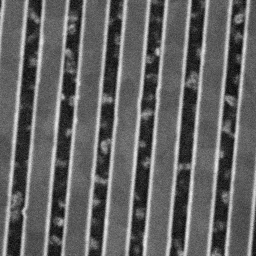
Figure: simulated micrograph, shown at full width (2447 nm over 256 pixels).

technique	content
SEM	parallel lines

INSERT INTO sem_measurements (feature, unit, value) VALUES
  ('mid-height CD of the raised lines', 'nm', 226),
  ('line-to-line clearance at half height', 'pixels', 16.9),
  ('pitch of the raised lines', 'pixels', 40.7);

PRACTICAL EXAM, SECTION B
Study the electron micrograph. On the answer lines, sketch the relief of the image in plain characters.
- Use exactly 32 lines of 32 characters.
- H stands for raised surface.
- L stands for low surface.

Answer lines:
HHHLLHHHLLLHHHLLHHHLLHHHLLHHHLLH
HHHLLHHHLLHHHHLLHHHLLHHHLLHHHLLH
HHHLLHHHLLHHHLLHHHLLLHHHLLHHHLLH
HHHLLHHHLLHHHLLHHHLLLHHLLLHHHLLH
HHHLLHHHLLHHHLLHHHLLHHHLLLHHLLLH
HHHLLHHHLLHHHLLHHHLLHHHLLHHHLLLH
HHHLLHHHLLHHHLLHHHLLHHHLLHHHLLHH
HHHLLHHHLLHHHLLHHHLLHHHLLHHHLLHH
HHHLLHHHLLHHHLLHHHLLHHHLLHHHLLHH
HHHLLHHHLLHHHLLHHHLLHHHLLHHHLLHH
HHHLLHHHLLHHHLLHHHLLHHHLLHHHLLHH
HHLLHHHHLLHHHLLHHHLLHHHLLHHHLLHH
HHLLHHHLLLHHHLLHHHLLHHHLLHHHLLHH
HHLLHHHLLHHHLLLHHLLLHHHLLHHHLLHH
HHLLHHHLLHHHLLHHHLLLHHLLLHHHLLHH
HHLLHHHLLHHHLLHHHLLHHHLLLHHLLLHH
HHLLHHHLLHHHLLHHHLLHHHLLHHHLLLHH
HHLLHHHLLHHHLLHHHLLHHHLLHHHLLHHH
HHLLHHHLLHHHLLHHHLLHHHLLHHHLLHHH
HHLLHHHLLHHHLLHHHLLHHHLLHHHLLHHH
HHLLHHHLLHHHLLHHHLLHHHLLHHHLLHHH
HHLLHHHLLHHHLLHHHLLHHHLLHHHLLHHH
HLLLHHLLLHHHLLHHHLLHHHLLHHHLLHHH
HLLHHHLLLHHHLLHHHLLHHHLLHHHLLHHH
HLLHHHLLHHHLLLHHLLLHHHLLHHHLLHHH
HLLHHHLLHHHLLHHHLLLHHHLLHHHLLHHH
HLLHHHLLHHHLLHHHLLHHHLLLHHHLLHHH
HLLHHHLLHHHLLHHHLLHHHLLLHHLLLHHH
HLLHHHLLHHHLLHHHLLHHHLLHHHLLLHHL
HLLHHHLLHHHLLHHHLLHHHLLHHHLLHHHL
HLLHHHLLHHHLLHHHLLHHHLLHHHLLHHHL
HLLHHHLLHHHLLHHHLLHHHLLHHHLLHHHL